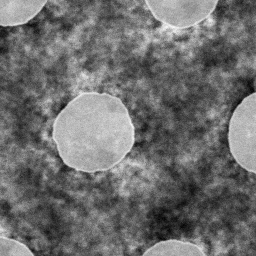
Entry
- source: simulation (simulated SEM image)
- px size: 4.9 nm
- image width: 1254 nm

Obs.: raised bodies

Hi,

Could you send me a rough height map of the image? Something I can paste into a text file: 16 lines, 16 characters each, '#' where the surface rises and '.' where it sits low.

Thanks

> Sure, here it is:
###......####...
#.........##....
................
................
................
................
....####.......#
....####......##
...#####......##
....####......##
.....##........#
................
................
................
................
##.......###....